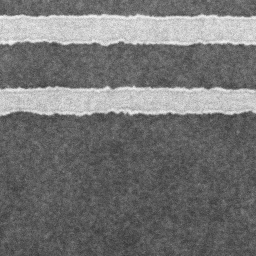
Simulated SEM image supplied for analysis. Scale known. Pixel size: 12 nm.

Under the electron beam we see one or a few lines or trenches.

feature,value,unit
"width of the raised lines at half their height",24.6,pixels